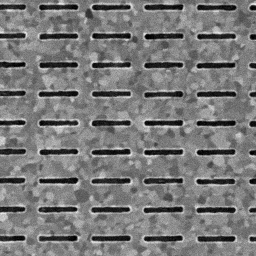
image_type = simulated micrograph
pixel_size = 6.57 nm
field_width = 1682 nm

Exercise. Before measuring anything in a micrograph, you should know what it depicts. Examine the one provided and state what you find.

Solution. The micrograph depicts a regular array of holes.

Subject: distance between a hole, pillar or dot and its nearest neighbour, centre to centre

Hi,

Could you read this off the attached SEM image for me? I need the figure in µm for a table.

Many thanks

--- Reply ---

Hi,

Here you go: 0.189